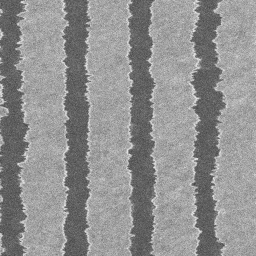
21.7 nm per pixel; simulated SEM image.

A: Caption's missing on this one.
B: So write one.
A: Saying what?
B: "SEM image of one or a few lines or trenches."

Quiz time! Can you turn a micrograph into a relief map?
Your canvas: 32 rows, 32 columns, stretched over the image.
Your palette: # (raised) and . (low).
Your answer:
...#####...#####...######..#####
...#####...#####...######..#####
...#####...#####...######...####
..######...#####...#####...#####
...#####...#####...#####...#####
...#####...#####...#####...#####
...#####...#####...#####...#####
...#####...#####...######..#####
..######...#####...######...####
...#####...#####...#####....####
...#####...#####...#####...#####
...#####...#####...#####....####
...#####...#####...#####....####
...#####...#####...#####....####
#..#####...#####...######...####
...#####...#####...######..#####
....####...#####...#####...#####
...#####...#####...#####...#####
....####...#####...#####...#####
...#####...#####...#####...#####
...#####...#####...#####...#####
...#####...#####....####...#####
...#####...#####....####...#####
...#####...#####...#####...#####
...#####...#####...#####...#####
...#####...#####...#####...#####
...#####...#####...#####...#####
...#####...#####...#####...#####
...#####...#####...######..#####
...#####...#####...######..#####
...#####...#####...######...####
...#####...#####...#####....####